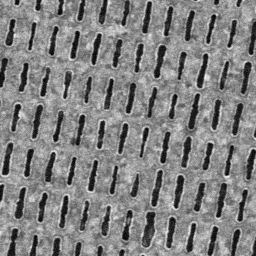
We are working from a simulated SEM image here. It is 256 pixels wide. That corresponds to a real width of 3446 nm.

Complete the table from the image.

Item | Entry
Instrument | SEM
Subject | a regular array of holes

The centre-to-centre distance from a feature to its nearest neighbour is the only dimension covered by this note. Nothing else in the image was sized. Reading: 291 nanometres